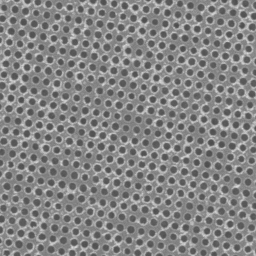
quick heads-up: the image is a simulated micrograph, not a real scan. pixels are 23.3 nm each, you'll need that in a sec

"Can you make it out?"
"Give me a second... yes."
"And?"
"a regular array of holes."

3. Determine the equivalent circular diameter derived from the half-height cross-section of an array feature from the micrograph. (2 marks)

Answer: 172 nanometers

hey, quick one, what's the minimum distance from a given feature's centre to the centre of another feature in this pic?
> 249 nm